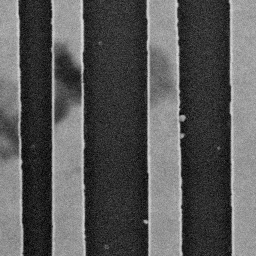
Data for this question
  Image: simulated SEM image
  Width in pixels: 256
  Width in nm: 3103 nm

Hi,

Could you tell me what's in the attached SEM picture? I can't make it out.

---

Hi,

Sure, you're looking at lines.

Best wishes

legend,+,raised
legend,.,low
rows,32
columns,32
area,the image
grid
++.....+++.........+++.......+++
++.....+++.........+++.......+++
++.....+++.........+++.......+++
++.....+++.........+++.......+++
++.....+++.........+++.......+++
++.....+++.........+++.......+++
++.....+++.........+++.......+++
++.....+++.........+++.......+++
++.....+++.........+++.......+++
++.....+++.........+++.......+++
++.....+++.........+++.......+++
++.....+++.........+++.......+++
++.....+++.........+++.......+++
+++....+++.........+++.......+++
++.....+++.........+++.......+++
++.....+++.........+++.......+++
++.....+++.........+++.......+++
+++....+++.........+++.......+++
+++....+++.........+++.......+++
+++....+++.........++++......+++
+++....+++.........+++.......+++
+++....+++.........++++......+++
+++....+++.........++++......+++
+++....+++.........++++......+++
+++....+++.........++++......+++
+++....+++.........++++......+++
+++....+++.........++++......+++
+++....+++.........++++......+++
+++....+++.........++++......+++
+++....+++.........++++......+++
+++....+++.........++++......+++
+++....+++.........++++......+++